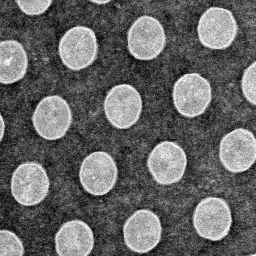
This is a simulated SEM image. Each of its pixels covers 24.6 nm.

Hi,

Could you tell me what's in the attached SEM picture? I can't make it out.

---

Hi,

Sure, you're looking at a regular array of raised bodies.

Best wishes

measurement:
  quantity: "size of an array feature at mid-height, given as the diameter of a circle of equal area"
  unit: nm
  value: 987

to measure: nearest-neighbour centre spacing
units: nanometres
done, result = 1710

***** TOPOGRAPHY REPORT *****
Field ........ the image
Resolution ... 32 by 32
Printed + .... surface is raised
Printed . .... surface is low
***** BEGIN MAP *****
..++++..........................
...++.....................+++...
.................++......++++...
.........++.....++++.....++++...
........++++....+++++....++++...
++.....+++++....+++++....++++...
+++....+++++....++++............
+++.....++++....................
+++......+.....................+
+++....................++.....++
......................++++....++
..............+++.....++++....++
.....+++.....+++++....++++.....+
.....++++....+++++....++++......
....+++++....++++......+........
....+++++.....+++...............
.....+++.....................++.
............................++++
...................++++.....++++
...........+++.....++++.....++++
...++.....++++....+++++.....++++
..++++....+++++....++++.........
.+++++....++++......++..........
.+++++.....+++..................
..++++..........................
...+.....................+++....
.................++.....+++++...
................++++....+++++...
........+++....+++++....+++++...
++.....+++++....++++.....+++....
+++....+++++....++++............
+++....++++......+..............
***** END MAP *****